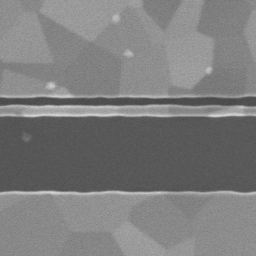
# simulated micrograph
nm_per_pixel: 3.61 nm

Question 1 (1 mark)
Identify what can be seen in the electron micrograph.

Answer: wiring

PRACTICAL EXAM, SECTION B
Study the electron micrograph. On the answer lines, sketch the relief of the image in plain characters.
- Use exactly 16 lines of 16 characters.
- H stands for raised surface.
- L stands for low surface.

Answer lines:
HHHHHHHHHHHHHHHH
HHHHHHHHHHHHHHHH
HHHHHHHHHHHHHHHH
HHHHHHHHHHHHHHHH
HHHHHHHHHHHHHHHH
HHHHHHHHHHHHHHHH
LHLLLLLLLHHLLLLL
LLLLLLLLLLLLLLLL
LLLLLLLLLLLLLLLL
LLLLLLLLLLLLLLLL
LLLLLLLLLLLLLLLL
LLLLLLLLLLLLLLLL
HHHHHHHHHHHHHHHH
HHHHHHHHHHHHHHHH
HHHHHHHHHHHHHHHH
HHHHHHHHHHHHHHHH